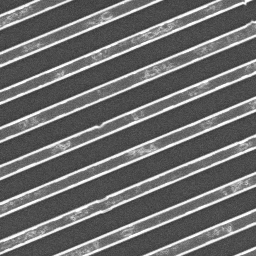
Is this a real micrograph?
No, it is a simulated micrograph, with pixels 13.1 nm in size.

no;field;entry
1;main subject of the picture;parallel lines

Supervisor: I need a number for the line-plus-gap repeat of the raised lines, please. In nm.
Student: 455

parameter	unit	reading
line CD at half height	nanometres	154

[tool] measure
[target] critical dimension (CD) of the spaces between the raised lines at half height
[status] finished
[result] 295 nm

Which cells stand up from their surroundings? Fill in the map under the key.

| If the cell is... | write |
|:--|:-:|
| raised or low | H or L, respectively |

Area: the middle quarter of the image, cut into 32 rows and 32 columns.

HHHHHHHLLLLLLLLLLLLLLHHHHHHHHHLL
HHHHHLLLLLLLLLLLLLLHHHHHHHHLLLLL
HHLLLLLLLLLLLLLLHHHHHHHHHLLLLLLL
LLLLLLLLLLLLLLHHHHHHHHHLLLLLLLLL
LLLLLLLLLLLLHHHHHHHHLLLLLLLLLLLL
LLLLLLLLLHHHHHHHHHLLLLLLLLLLLLLL
LLLLLLLHHHHHHHHLLLLLLLLLLLLLLLHH
LLLLHHHHHHHHHLLLLLLLLLLLLLLLHHHH
LLHHHHHHHHHLLLLLLLLLLLLLLHHHHHHH
HHHHHHHHLLLLLLLLLLLLLLLHHHHHHHLL
HHHHHHLLLLLLLLLLLLLLLHHHHHHHLLLL
HHHLLLLLLLLLLLLLLLHHHHHHHHLLLLLL
HLLLLLLLLLLLLLLLHHHHHHHLLLLLLLLL
LLLLLLLLLLLLLHHHHHHHHLLLLLLLLLLL
LLLLLLLLLLLHHHHHHHLLLLLLLLLLLLLL
LLLLLLLLLHHHHHHHLLLLLLLLLLLLLLLH
LLLLLLHHHHHHHHLLLLLLLLLLLLLLHHHH
LLLLHHHHHHHLLLLLLLLLLLLLLLHHHHHH
LHHHHHHHHLLLLLLLLLLLLLLLHHHHHHHL
HHHHHHLLLLLLLLLLLLLLLHHHHHHHHLLL
HHHHLLLLLLLLLLLLLLLHHHHHHHHLLLLL
HLLLLLLLLLLLLLLLHHHHHHHHLLLLLLLL
LLLLLLLLLLLLLLHHHHHHHHLLLLLLLLLL
LLLLLLLLLLLHHHHHHHHHLLLLLLLLLLLL
LLLLLLLLLHHHHHHHHLLLLLLLLLLLLLLL
LLLLLLLHHHHHHHHLLLLLLLLLLLLLLLHH
LLLLHHHHHHHHLLLLLLLLLLLLLLLHHHHH
LLHHHHHHHHLLLLLLLLLLLLLLLHHHHHHH
HHHHHHHLLLLLLLLLLLLLLLHHHHHHHHLL
HHHHHLLLLLLLLLLLLLLLHHHHHHHLLLLL
HHHLLLLLLLLLLLLLLHHHHHHHHLLLLLLL
LLLLLLLLLLLLLLLHHHHHHHHLLLLLLLLL